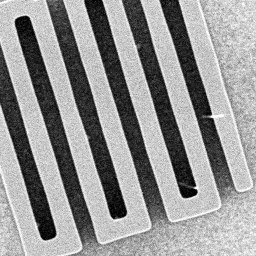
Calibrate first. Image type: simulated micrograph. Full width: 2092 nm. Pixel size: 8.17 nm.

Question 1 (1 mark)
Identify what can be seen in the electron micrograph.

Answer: groups of lines, slits or small figures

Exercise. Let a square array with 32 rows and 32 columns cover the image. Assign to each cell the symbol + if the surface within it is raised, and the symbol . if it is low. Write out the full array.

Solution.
++++++..+++..++...++..+++.......
++++++..+++..+++..++...++.......
++..++...++...++..+++..+++......
++..+++..++...++...++..+++......
++..+++..+++..+++..++...++......
++...++...++..+++..+++..+++.....
+++..+++..++...++..+++..+++.....
.++..+++..+++..++...++..+++.....
.++...++...++..+++..+++..++.....
.+++..++...++...++..+++..+++....
..++..+++..+++..++...++..+++....
..++...++...++..+++..++...++....
..+++..++...++..+++..+++..+++...
...++..+++..+++..++...++..+++...
...++...++..+++..+++..++...++...
+..+++..++...++..+++..+++..++...
+..+++..+++..++...++...++..+++..
+...++..+++..+++..++...++...++..
++..++...++...++..+++..+++..++..
++..+++..+++..++...++..+++..+++.
++..+++..+++..+++..++...++...++.
+++..++...++...++..+++..+++..++.
+++..+++..++...++...++..+++..+++
.++..+++..+++..+++..++...++...+.
.++...++...++..+++..+++.+++.....
.+++..+++..++...++..++++++++....
..++..+++..+++..++...+++++......
..++...++...+++++++..++.........
..+++..+++..+++++++.............
...++..+++..++++................
...+++++++......................
...+++++++......................